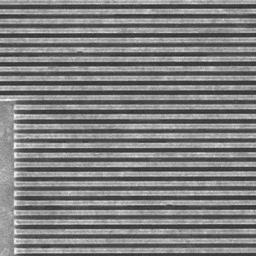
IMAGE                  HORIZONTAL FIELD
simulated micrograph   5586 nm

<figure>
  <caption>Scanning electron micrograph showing parallel lines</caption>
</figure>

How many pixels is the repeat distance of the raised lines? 9.56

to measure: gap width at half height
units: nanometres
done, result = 98.2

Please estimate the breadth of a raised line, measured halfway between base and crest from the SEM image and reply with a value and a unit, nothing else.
4.5 px